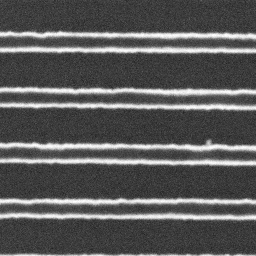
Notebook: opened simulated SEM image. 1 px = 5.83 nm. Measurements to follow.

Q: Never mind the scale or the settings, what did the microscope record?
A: lines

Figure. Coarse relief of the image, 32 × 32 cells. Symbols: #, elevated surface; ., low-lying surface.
................................
................................
................................
................................
################################
################################
................................
................................
................................
................................
................................
################################
################################
.......................#....####
................................
................................
................................
................................
#########################.#####.
################################
................................
................................
................................
................................
................................
################################
################################
................................
................................
................................
................................
................................